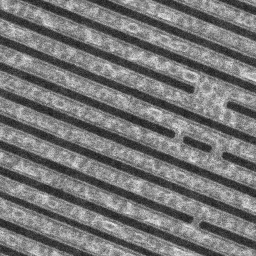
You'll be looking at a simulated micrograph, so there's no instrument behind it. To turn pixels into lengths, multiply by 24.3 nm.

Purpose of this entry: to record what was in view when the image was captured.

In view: parallel lines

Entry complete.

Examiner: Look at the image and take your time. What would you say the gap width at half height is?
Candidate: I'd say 345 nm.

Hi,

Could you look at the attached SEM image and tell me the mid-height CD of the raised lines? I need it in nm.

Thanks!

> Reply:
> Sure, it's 252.